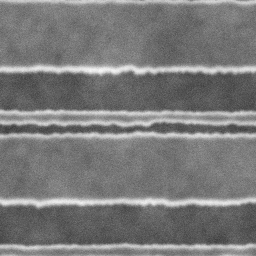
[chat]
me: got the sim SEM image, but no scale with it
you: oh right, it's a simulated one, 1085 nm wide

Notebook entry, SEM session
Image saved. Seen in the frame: lines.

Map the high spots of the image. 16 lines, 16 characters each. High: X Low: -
XXXXXXXXXXXXXXXX
XXXXXXXXXXXXXXXX
XXXXXXXXXXXXXXXX
XXXXXXXXXXXXXXXX
----------------
----------------
----------------
XXXXXXXXXXXXXXXX
XXXXXXXXXXXXXXXX
XXXXXXXXXXXXXXXX
XXXXXXXXXXXXXXXX
XXXXXXXXXXXXXXXX
XXXXXXXXXXXXXXXX
----------------
----------------
XXXXXXXXXXXXXXXX